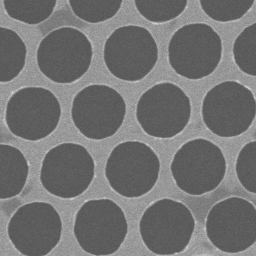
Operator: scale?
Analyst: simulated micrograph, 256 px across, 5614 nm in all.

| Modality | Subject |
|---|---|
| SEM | a regular array of holes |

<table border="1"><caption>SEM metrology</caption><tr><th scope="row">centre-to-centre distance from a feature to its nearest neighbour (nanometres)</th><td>1430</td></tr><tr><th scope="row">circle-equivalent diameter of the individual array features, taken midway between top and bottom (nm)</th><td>1210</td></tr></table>